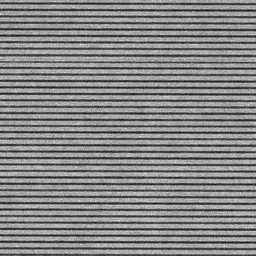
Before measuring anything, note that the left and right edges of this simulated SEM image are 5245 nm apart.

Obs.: parallel lines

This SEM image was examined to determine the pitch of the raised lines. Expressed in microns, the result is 0.132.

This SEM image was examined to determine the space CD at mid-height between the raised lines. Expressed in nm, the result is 53.8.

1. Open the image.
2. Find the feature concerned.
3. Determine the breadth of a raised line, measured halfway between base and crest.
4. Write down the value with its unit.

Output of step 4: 74.3 nm